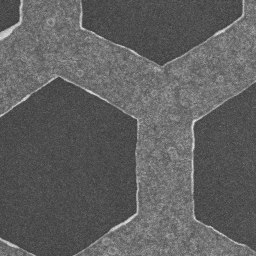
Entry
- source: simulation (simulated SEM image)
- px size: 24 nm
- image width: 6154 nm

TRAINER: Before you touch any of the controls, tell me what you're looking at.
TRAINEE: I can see holes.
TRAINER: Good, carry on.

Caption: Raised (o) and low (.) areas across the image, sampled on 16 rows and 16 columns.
.oooo..........o
.oooo..........o
ooooooo......ooo
ooooooooo..ooooo
oooooooooooooooo
ooo..oooooooooo.
o......ooooooo..
........oooo....
.........ooo....
........oooo....
.........ooo....
.........ooo....
.........ooo....
........oooo....
.......ooooooo..
o....ooooooooooo